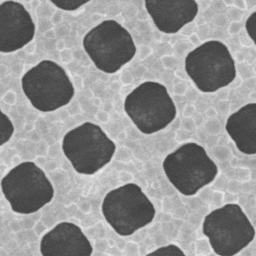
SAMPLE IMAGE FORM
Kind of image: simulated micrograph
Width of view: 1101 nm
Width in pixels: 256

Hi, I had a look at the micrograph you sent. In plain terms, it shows holes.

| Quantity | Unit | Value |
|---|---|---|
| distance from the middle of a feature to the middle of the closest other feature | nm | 313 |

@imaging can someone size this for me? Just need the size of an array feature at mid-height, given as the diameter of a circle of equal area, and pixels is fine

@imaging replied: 50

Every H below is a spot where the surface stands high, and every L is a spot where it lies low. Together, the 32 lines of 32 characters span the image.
LLLHHHHLLLHHHHHHHHLLLLLLLHHHHHHH
LLLHHHHHHHHHHHHHHHLLLLLLLHHHHHHH
LLLLHHHHHHHHHHHHHHHLLLLLHHHHHHHL
LLLLHHHHHHHHLLLHHHHHLLLHHHHHHHHL
LLLLHHHHHHHLLLLLHHHHHHHHHHHHHHHL
LLLHHHHHHHLLLLLLLHHHHHHHHLLLHHHH
LHHHHHHHHHHLLLLLLHHHHHHHLLLLLHHH
HHHHHHHHHHHLLLLLHHHHHHHLLLLLLHHH
HHHHLLLLHHHHLLLHHHHHHHHLLLLLLHHH
HHHLLLLLLHHHHHHHHHHHHHHHLLLLLHHH
HHHLLLLLLHHHHHHHHHLLHHHHLLLLLHHH
HHHLLLLLLHHHHHHHLLLLLHHHHHHHHHHH
HHHHLLLLLHHHHHHHLLLLLLHHHHHHHHHH
HHHHLLLHHHHHHHHHLLLLLLHHHHHHHHLL
LHHHHHHHHHHHHHHHLLLLLLHHHHHHHLLL
LLHHHHHHHHLLHHHHHLLLLHHHHHHHLLLL
LLHHHHHHHLLLLHHHHHLHHHHHHHHHLLLL
LHHHHHHHLLLLLLHHHHHHHHHHHHHHHLLL
HHHHHHHHLLLLLLHHHHHHHHLLLHHHHHLL
HHHHHHHHLLLLLLHHHHHHHLLLLLHHHHHH
HHHLHHHHHLLLLHHHHHHHLLLLLLLHHHHH
HLLLLHHHHHLLHHHHHHHHHLLLLLLHHHHH
LLLLLLHHHHHHHHHHHHHHHLLLLLLHHHHH
LLLLLLLHHHHHHHHLLHHHHHLLLHHHHHHH
HLLLLLLHHHHHHLLLLLHHHHHHHHHHHHHH
HLLLLLHHHHHHHLLLLLLHHHHHHHHHHHHH
HHLLHHHHHHHHHLLLLLLHHHHHHHLLLLHH
HHHHHHHHHHHHHLLLLLLHHHHHHHLLLLLH
HHHHHHHLLLHHHHLLLLHHHHHHHLLLLLLL
HHHHHLLLLLLHHHHHHHHHHHHHHHLLLLLL
HHHHHLLLLLLHHHHHHHHHHHHHHHLLLLLH
HHHHHLLLLLLHHHHHHHHLLLLHHHHLLLHH